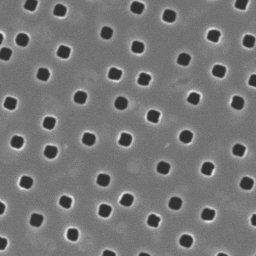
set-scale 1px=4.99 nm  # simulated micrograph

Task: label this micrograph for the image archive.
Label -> a regular array of holes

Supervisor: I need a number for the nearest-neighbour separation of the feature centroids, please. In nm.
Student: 171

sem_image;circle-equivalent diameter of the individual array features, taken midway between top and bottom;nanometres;67.2